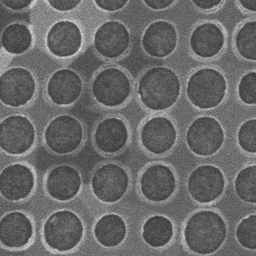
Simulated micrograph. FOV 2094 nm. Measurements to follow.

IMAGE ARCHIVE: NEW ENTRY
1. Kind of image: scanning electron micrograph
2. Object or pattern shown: a regular array of holes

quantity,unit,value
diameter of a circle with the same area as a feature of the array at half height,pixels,36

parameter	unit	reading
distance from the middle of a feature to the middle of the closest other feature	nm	386